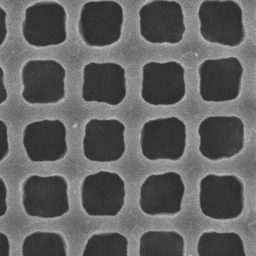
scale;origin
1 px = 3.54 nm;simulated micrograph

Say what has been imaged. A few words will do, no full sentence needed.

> a regular array of holes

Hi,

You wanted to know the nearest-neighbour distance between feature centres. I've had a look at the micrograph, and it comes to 198 nm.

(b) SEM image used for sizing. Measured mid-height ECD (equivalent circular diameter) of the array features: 161 nanometres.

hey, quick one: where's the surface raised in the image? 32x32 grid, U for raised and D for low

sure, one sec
UUUUDDDUUUUDDDDUUUUDDDUUUDDDDDUU
DUUDDDDDUUDDDDDUUDDDDDDUUDDDDDUU
DUUDDDDDUUDDDDDUUDDDDDDUUDDDDDUU
DUUDDDDDUUDDDDDUUUDDDDDUUDDDDDUU
DUUDDDDDUUDDDDDUUUDDDDDUUDDDDDDU
UUUUDDDUUUUDDDUUUUUUUUUUUUUDDDUU
UUUUUUUUUUUUUUUUUUUUUUUUUUUUUUUU
UUUUDUUUUUUUUUUUUUUUUUUUUUDDDDUU
UUUDDDDDUUUDDDDUUUDDDDDUUDDDDDUU
UUUDDDDDUUDDDDDDUUDDDDDUUDDDDDUU
UUUDDDDDUUDDDDDDUUDDDDDUUDDDDDUU
DUUDDDDDUUDDDDDDUUDDDDDUUDDDDDUU
DUUDDDDUUUUDDDDUUUDDDDUUUUDDDUUU
UUUUUUUUUUUUUUUUUUUUUUUUUUUUUUUU
UUUUUUUUUUUUUUUUUUUUUUUUUUUUUUUU
DUUUDDDDUUUDDDDUUUDDDDDUUDDDDDUU
DUUDDDDDUUUDDDDDUUDDDDDUUDDDDDUU
DUUDDDDDUUDDDDDDUUDDDDDUUDDDDDUU
DUUDDDDDUUDDDDDDUUDDDDDUUDDDDDUU
DUUUDDDDUUUDDDDUUUDDDDDUUUDDDUUU
UUUUUUUUUUUUUUUUUUUUUUUUUUUUUUUU
UUUUUUUUUUUUUUUUUUUUUDUUUUUUUUUU
UUUDDDDDUUUDDDDUUUDDDDDUUDDDDDUU
DUUDDDDDUUDDDDDDUUDDDDDUUDDDDDUU
DUUDDDDDUUDDDDDDUDDDDDDUUDDDDDUU
DUUDDDDDDUDDDDDUUUDDDDDUUDDDDDUU
DUUDDDDDUUUDDDDUUUDDDDUUUDDDDDUU
UUUUUUUUUUUUUUUUUUUUUUUUUUUUUUUU
UUUUUUUUUUUUUUUUUUUUUUUUUUUUUUUU
DUUUDDDUUUUUDDDUUUDDDDDUUDDDDDUU
DUUDDDDDUUUDDDDDUDDDDDDUUDDDDDUU
DUUDDDDDUUDDDDDDUDDDDDDUUDDDDDDU